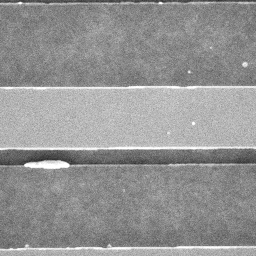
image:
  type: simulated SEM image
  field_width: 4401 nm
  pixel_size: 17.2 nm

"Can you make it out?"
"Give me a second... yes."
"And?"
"lines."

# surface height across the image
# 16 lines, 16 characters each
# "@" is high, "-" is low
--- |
----------------
----------------
----------------
----------------
----------------
@@@@@@@@@@@@@@@@
@@@@@@@@@@@@@@@@
@@@@@@@@@@@@@@@@
@@@@@@@@@@@@@@@@
----------------
----------------
----------------
----------------
----------------
----------------
-----------@@@@@